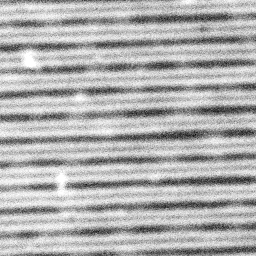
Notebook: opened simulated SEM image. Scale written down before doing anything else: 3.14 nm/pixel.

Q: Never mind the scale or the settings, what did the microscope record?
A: parallel lines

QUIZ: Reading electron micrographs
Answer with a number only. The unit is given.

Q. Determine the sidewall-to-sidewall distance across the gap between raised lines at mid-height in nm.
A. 23.1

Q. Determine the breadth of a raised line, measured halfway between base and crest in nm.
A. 49.4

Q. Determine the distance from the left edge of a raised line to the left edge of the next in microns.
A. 0.0732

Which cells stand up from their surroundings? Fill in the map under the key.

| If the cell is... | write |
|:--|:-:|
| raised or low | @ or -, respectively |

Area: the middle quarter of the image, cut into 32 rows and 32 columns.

@@@@@@@@@@@@@@@@@@@@@@@@@@@@@@@@
@@@@@@@@@@@@@@@@@@@@@@@@@@@@@@@@
@@@@@@@@@@@@@@@@@@@@@@@@--------
--------------------------------
--------------------------@@@@@@
@@@@@@@@@@@@@@@@@@@@@@@@@@@@@@@@
@@@@@@@@@@@@@@@@@@@@@@@@@@@@@@@@
@@@@@@@@@@@@@@@@@@@@@@@@@@@@@@@@
@@@@@@@@@@@---------------------
--------------------------------
--------------@@@@@@@@@@@@@@@@@@
@@@@@@@@@@@@@@@@@@@@@@@@@@@@@@@@
@@@@@@@@@@@@@@@@@@@@@@@@@@@@@@@@
@@@@@@@@@@@@@@@@@@@@@@@@@@@@@@@@
@@@@@@@@@@@@@@@-----------------
--------------------------------
-------------------@@@@@@@@@@@@@
@@@@@@@@@@@@@@@@@@@@@@@@@@@@@@@@
@@@@@@@@@@@@@@@@@@@@@@@@@@@@@@@@
@@@@@@@@@@@@@@@@@@@@@@@@@@@@@@@@
@@@@@@--------------------------
--------------------------------
--------@@@--@@@@@@@@@@@@@@@@@@@
@@@@@@@@@@@@@@@@@@@@@@@@@@@@@@@@
@@@@@@@@@@@@@@@@@@@@@@@@@@@@@@@@
@@@@@@@@@@@@@@@@@@@@@@@@@@@@----
--------------------------------
------------------------------@@
--------@@@@@@@@@@@@@@@@@@@@@@@@
@@@@@@@@@@@@@@@@@@@@@@@@@@@@@@@@
@@@@@@@@@@@@@@@@@@@@@@@@@@@@@@@@
@@@@@@@@@@@@@@@@@@@@@----@@@----